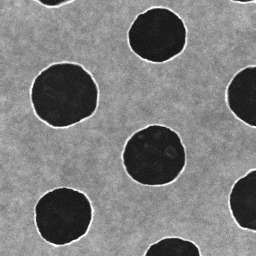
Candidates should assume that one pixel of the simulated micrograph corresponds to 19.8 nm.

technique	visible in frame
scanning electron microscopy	holes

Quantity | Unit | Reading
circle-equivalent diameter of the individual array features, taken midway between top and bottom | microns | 1.17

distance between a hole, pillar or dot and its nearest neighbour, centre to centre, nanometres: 2160